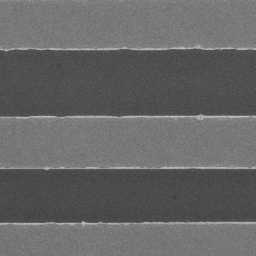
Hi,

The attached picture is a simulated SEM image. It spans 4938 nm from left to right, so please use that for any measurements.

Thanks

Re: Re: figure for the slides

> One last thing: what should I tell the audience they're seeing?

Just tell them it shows lines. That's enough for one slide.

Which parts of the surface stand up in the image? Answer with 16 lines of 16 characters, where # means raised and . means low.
################
################
################
................
................
................
................
################
################
################
################
................
................
................
################
################